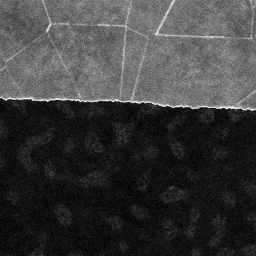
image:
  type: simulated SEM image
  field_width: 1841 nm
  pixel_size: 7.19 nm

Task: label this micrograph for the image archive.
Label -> one or a few lines or trenches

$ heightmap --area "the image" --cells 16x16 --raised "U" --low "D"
UUUUUUUUUUUUUUUU
UUUUUUUUUUUUUUUU
UUUUUUUUUUUUUUUU
UUUUUUUUUUUUUUUU
UUUUUUUUUUUUUUUU
UUUUUUUUUUUUUUUU
DDDDDDDDDUUUUUUU
DDDDDDDDDDDDDDDD
DDDDDDDDDDDDDDDD
DDDDDDDDDDDDDDDD
DDDDDDDDDDDDDDDD
DDDDDDDDDDDDDDDD
DDDDDDDDDDDDDDDD
DDDDDDDDDDDDDDDD
DDDDDDDDDDDDDDDD
DDDDDDDDDDDDDDDD